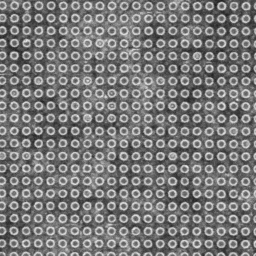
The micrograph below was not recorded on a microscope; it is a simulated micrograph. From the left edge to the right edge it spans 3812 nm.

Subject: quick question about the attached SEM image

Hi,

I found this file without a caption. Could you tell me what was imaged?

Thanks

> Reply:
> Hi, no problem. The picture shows a regular array of raised bodies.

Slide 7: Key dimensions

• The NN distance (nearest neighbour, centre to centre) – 177 nm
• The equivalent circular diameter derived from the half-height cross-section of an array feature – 112 nm